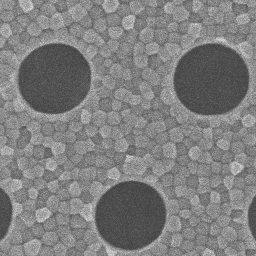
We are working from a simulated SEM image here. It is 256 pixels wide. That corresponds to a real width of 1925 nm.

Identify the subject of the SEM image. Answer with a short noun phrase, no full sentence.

holes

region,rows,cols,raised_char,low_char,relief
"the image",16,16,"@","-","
@@@@@@@@@@@@@@@@
@@@@@@@@@@@@@@@@
@@@@@@@@@@@@@@@@
@@---@@@@@@----@
@-----@@@@@-----
@-----@@@@@-----
@@---@@@@@@----@
@@@@@@@@@@@@@@@@
@@@@@@@@@@@@@@@@
@@@@@@@@@@@@@@@@
@@@@@@@@@@@@@@@@
@@@@@@@--@@@@@@@
-@@@@@----@@@@@@
-@@@@@----@@@@@@
@@@@@@----@@@@@@
@@@@@@@--@@@@@@@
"